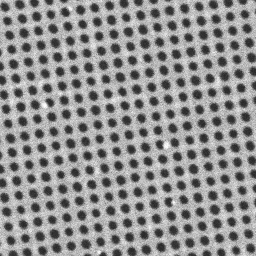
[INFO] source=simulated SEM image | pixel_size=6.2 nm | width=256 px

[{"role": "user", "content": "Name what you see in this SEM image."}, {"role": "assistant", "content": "a regular array of holes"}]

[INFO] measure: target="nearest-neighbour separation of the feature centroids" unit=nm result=88.7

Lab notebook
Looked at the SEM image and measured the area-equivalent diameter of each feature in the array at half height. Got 60.6 nanometres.